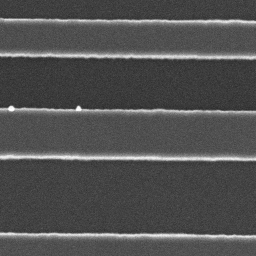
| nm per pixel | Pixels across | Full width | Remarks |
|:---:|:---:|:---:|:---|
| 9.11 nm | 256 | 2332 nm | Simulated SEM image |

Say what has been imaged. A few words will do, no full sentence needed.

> lines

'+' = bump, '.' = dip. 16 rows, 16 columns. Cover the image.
................
++++++++++++++++
++++++++++++++++
......++++++++++
................
................
................
++++++++++++++++
++++++++++++++++
++++++++++++++++
................
................
................
................
................
++++++++++++++++